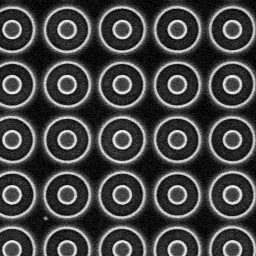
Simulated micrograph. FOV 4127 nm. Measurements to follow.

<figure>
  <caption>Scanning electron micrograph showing an array of small figures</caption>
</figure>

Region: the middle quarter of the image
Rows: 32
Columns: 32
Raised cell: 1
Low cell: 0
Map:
00001111111100000111111111000001
00000111110000000001111100000000
00000011110000000001111000000000
11000011100001110000111000011100
11100011100001110000111000111100
11100011100001111000111000111100
11100011100001110000111000011100
00000011110000000001111000000000
00000111110000000001111100000000
00001111111000000011111110000000
00111111111110001111111111100111
11111111111111111111111111111111
11111111111111111111111111111111
00111111111110001111111111100011
00001111111000000011111110000000
00000111110000000001111100000000
00000011110000000000111000000000
11000011100001110000111000011100
11100011100001111000111000111100
11100011100001110000111000111100
11000011100001110000111000011100
00000011110000000001111000000000
00000111110000000001111100000000
00001111111000000011111110000001
01111111111111011111111111110111
11111111111111111111111111111111
11111111111111111111111111111111
00111111111110001111111111100011
00001111111000000011111110000000
00000111110000000001111100000000
00000011110000000001111000000000
11100011100001110000111000011100